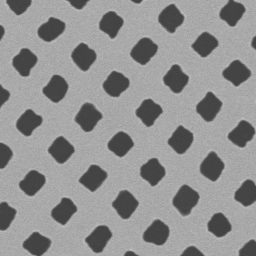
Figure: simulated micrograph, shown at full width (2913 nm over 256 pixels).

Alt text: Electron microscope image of a regular array of holes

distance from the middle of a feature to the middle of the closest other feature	0.481	micrometres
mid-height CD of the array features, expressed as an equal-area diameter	278	nm